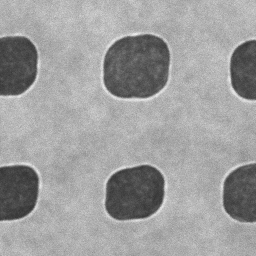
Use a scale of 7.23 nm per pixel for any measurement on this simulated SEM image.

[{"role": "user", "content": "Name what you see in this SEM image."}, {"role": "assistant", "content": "holes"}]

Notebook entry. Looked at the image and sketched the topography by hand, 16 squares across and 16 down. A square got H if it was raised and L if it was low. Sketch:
HHHHHHHHHHHHHHHH
HHHHHHHHHHHHHHHH
LLHHHHHLLLHHHHHH
LLHHHHHLLLLHHHLL
LLHHHHLLLLLHHHLL
LLHHHHHLLLHHHHHL
HHHHHHHHHHHHHHHH
HHHHHHHHHHHHHHHH
HHHHHHHHHHHHHHHH
HHHHHHHHHHHHHHHH
LLHHHHHHLLHHHHHL
LLHHHHHLLLHHHHLL
LLHHHHHLLLHHHHLL
LLHHHHHLLHHHHHLL
HHHHHHHHHHHHHHHH
HHHHHHHHHHHHHHHH